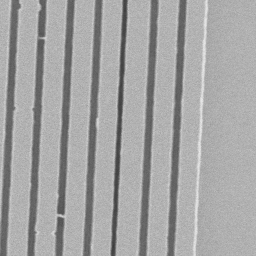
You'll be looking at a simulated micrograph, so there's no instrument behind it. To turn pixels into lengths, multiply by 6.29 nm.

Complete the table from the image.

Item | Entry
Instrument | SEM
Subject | parallel lines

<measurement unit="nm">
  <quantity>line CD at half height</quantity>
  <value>130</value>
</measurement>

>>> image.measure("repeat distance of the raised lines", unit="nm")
176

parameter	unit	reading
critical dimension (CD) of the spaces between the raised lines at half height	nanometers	43.9